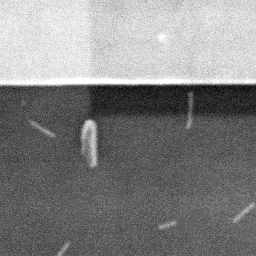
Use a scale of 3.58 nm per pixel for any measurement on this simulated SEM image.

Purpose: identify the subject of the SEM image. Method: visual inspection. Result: wiring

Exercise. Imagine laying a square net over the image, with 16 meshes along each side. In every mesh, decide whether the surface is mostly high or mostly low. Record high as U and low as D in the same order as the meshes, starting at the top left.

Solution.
UUUUUUUUUUUUUUUU
UUUUUUUUUUUUUUUU
UUUUUUUUUUUUUUUU
UUUUUUUUUUUUUUUU
UUUUUUUUUUUUUUUU
DDDDDDDDDDDDDDDD
DDDDDDDDDDDDDDDD
DDDDDDDDDDDDDDDD
DDDDDUDDDDDDDDDD
DDDDDDDDDDDDDDDD
DDDDDDDDDDDDDDDD
DDDDDDDDDDDDDDDD
DDDDDDDDDDDDDDDD
DDDDDDDDDDDDDDDD
DDDDDDDDDDDDDDDD
DDDDDDDDDDDDDDDD